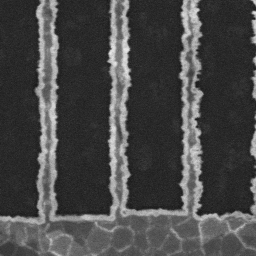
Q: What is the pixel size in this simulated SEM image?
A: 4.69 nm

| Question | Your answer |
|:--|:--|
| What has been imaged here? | one or a few lines or trenches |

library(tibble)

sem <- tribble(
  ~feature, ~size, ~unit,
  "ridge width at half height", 56.2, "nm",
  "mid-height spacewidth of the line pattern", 277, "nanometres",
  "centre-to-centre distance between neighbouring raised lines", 335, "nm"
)